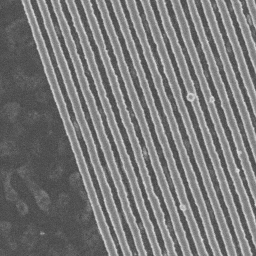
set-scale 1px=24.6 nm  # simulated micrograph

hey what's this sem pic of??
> parallel lines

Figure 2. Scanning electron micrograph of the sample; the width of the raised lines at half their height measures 189 nanometers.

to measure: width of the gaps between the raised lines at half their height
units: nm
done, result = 160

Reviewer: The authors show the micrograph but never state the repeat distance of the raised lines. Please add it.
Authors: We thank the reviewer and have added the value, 348 nm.